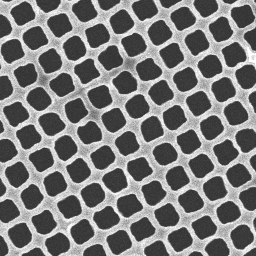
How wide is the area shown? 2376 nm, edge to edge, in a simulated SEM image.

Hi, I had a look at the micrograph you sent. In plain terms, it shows a regular array of holes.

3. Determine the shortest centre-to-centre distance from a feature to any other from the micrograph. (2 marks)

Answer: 246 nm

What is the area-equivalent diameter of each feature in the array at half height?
23.2 pixels